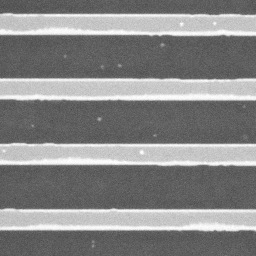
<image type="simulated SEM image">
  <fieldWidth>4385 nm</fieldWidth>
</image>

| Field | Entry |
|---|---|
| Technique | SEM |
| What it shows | lines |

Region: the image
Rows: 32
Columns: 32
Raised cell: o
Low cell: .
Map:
................................
................................
oooooooooooooooooooooooooooooooo
oooooooooooooooooooooooooooooooo
................................
................................
................................
................................
................................
................................
oooooooooooooooooooooooooooooooo
oooooooooooooooooooooooooooooooo
................................
................................
................................
................................
................................
................................
oooooooooooooooooooooooooooooooo
oooooooooooooooooooooooooooooooo
ooooooooo.oooooooooooooooooooooo
................................
................................
................................
................................
................................
oooooooooooooooooooooooooooooooo
oooooooooooooooooooooooooooooooo
oooooooooooooooooooooooooooooooo
................................
................................
................................